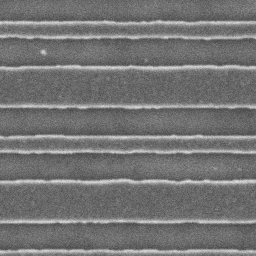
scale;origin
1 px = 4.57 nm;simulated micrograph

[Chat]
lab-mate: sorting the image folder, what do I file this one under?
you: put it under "lines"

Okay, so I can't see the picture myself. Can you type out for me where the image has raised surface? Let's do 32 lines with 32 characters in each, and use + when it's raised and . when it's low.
................................
................................
................................
++++++++++++++++++++++++++++++++
++++++++++++++++++++++++++++++++
................................
................................
................................
++++++++++++++++++++++++++++++++
++++++++++++++++++++++++++++++++
++++++++++++++++++++++++++++++++
++++++++++++++++++++++++++++++++
++++++++++++++++++++++++++++++++
................................
................................
................................
................................
++++++++++++++++++++++++++++++++
++++++++++++++++++++++++++++++++
................................
................................
................................
................................
++++++++++++++++++++++++++++++++
++++++++++++++++++++++++++++++++
++++++++++++++++++++++++++++++++
++++++++++++++++++++++++++++++++
++++++++++++++++++++++++++++++++
................................
................................
................................
++++++++++++++++++++++++++++++++